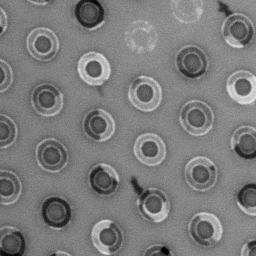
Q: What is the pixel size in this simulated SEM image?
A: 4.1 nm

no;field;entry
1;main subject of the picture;a regular array of ring-shaped raised bodies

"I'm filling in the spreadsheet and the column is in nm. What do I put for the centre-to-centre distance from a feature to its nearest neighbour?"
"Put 229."